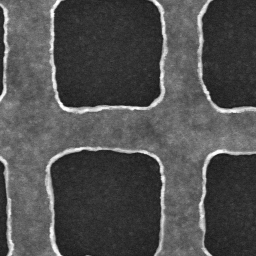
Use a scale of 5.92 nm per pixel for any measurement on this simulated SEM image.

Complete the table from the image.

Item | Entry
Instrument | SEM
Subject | holes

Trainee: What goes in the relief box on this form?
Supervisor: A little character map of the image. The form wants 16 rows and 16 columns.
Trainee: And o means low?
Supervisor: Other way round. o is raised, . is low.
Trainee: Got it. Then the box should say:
oooo......ooo...
ooo.......ooo...
ooo.......ooo...
ooo.......ooo...
ooo.......ooo...
oooo......ooo...
oooo.....oooo...
oooooooooooooooo
oooooooooooooooo
ooooo...oooooooo
ooo.......ooo...
ooo.......ooo...
ooo.......ooo...
ooo.......ooo...
ooo.......ooo...
.ooo......ooo...